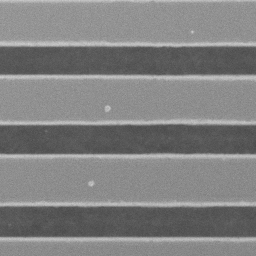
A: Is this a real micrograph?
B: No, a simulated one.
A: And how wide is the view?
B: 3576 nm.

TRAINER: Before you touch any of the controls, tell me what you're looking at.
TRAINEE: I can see lines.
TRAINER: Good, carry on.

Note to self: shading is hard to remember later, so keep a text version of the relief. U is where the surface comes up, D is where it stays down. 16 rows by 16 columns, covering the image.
UUUUUUUUUUUUUUUU
UUUUUUUUUUUUUUUU
UUUUUUUUUUUUUUUU
DDDDDDDDDDDDDDDD
DDDDDDDDDDDDDDDD
UUUUUUUUUUUUUUUU
UUUUUUUUUUUUUUUU
UUUUUUUUUUUUUUUU
DDDDDDDDDDDDDDDD
DDDDDDDDDDDDDDDD
UUUUUUUUUUUUUUUU
UUUUUUUUUUUUUUUU
UUUUUUUUUUUUUUUU
DDDDDDDDDDDDDDDD
DDDDDDDDDDDDDDDD
UUUUUUUUUUUUUUUU